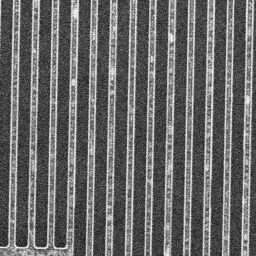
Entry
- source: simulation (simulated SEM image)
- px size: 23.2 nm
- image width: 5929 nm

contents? parallel lines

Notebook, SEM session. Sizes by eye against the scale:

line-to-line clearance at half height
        13.7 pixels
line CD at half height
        139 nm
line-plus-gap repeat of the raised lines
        451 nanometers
